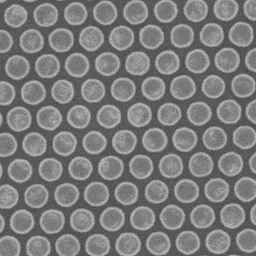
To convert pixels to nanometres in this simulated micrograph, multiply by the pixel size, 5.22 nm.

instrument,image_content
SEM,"a regular array of raised bodies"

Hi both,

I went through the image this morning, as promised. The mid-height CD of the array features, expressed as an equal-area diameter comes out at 122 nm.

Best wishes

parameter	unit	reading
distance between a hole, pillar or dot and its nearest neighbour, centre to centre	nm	154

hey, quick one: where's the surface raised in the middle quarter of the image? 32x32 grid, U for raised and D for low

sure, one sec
UUUUUUDDUUUUUUDUUUUUUDDUUUUUUDDU
DUUUUUDDUUUUUDDDUUUUUDDDUUUUDDDU
DDUUUDDDDDUUDDDDDUUUDDDDDDUDDDDD
DDDDDDDDDDDDDDDDDDDDDDUDDDDDUUUD
UDDDDUUUUDDDDUUUUDDDUUUUUDDUUUUU
UUDDDUUUUUDDUUUUUUDDUUUUUDDUUUUU
UUDDUUUUUUDDUUUUUUDDUUUUUDDUUUUU
UUDDUUUUUUDDUUUUUUDDUUUUUDDUUUUU
UUDDDUUUUDDDDUUUUDDDDUUUDDDDUUUD
UDDDDDDDDDDDDDDDDDDDDDDDDDDDDDDD
DDDUDDDDDDUUDDDDDUUUUDDDDUUUDDDD
DDUUUUDDDUUUUUDDUUUUUUDDUUUUUDDU
DUUUUUDDUUUUUUDDUUUUUUDDUUUUUDDU
DUUUUUDDUUUUUUDDUUUUUUDDUUUUUDDU
DUUUUUDDDUUUUUDDDUUUUDDDUUUUDDDD
DDUUUUDDDDUUUDDDDDUUDDDDDDDDDDDD
DDDDDDDDDDDDDDDDDDDDDDUUDDDDUUUU
UUDDDDUUUDDDDUUUUDDDUUUUUDDDUUUU
UUUDDUUUUUDDUUUUUUDDUUUUUUDUUUUU
UUUDDUUUUUDDUUUUUUDDUUUUUUDUUUUU
UUUDDUUUUUDDUUUUUUDDUUUUUDDDUUUU
UUDDDDUUUUDDDUUUUDDDDUUUDDDDDUUD
UDDDDDDDDDDDDDDDDDDDDDDDDDDDDDDD
DDDUUDDDDDUUUDDDDUUUUDDDDUUUUDDD
DDUUUUDDDUUUUUDDDUUUUUDDUUUUUDDU
DUUUUUUDDUUUUUUDUUUUUUDDUUUUUDDU
DUUUUUUDDUUUUUUDDUUUUUDDUUUUUDDU
DDUUUUDDDUUUUUDDDUUUUUDDDUUUUDDD
DDDUUUDDDDUUUDDDDDUDDDDDDDDDDDDD
DDDDDDDDDDDDDDDDDDDDDDUUDDDDDUUU
UUUDDDUUUUDDDDUUUUDDDUUUUUDDUUUU
UUUDDUUUUUUDDUUUUUDDUUUUUUDDUUUU